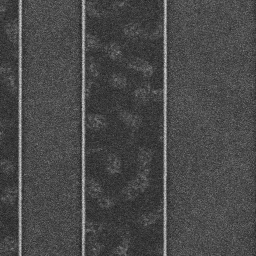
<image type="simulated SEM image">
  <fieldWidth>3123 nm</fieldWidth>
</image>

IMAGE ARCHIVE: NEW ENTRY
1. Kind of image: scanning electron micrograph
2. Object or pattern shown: one or a few lines or trenches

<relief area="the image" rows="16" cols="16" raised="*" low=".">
*....*****......
*....*****......
*....*****......
*....*****......
*....*****......
*....*****......
*....*****......
*....*****......
*....*****......
*....*****......
*....*****......
*....*****......
*....*****......
*....*****......
*....*****......
*....*****......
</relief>